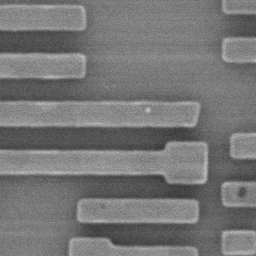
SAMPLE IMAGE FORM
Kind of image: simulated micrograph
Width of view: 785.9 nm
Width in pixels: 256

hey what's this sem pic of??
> wiring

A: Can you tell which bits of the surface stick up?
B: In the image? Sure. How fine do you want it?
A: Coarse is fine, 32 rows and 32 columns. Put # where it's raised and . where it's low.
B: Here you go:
............................####
###########.................####
###########.....................
##########......................
................................
............................####
............................####
###########.................####
###########.....................
##########......................
................................
................................
................................
#########################.......
#########################.......
########################........
................................
.............................###
.....................#####...###
##########################...###
##########################......
##########################......
.....................#####......
............................####
............................####
..........###############...####
..........###############.......
..........###############.......
................................
............................####
.........#####..............####
.........################...####